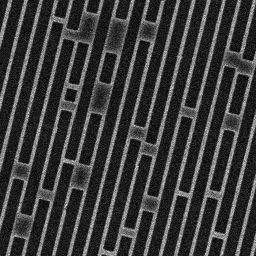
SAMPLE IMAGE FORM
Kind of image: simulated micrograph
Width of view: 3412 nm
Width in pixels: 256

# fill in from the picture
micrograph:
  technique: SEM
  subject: parallel lines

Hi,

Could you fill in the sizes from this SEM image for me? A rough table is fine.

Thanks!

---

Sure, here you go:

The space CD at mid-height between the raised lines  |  154 nm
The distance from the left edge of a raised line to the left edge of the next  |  0.197 um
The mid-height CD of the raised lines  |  0.0388 µm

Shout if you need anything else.